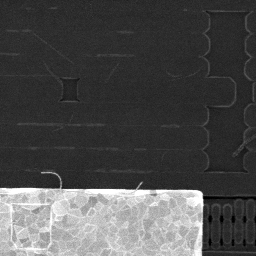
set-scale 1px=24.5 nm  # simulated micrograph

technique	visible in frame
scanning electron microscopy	wiring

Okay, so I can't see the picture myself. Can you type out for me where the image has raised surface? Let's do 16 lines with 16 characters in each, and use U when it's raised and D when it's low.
DDDDDDDDDDDDDDDD
DDDDDDDDDDDDDDDD
DDDDDDDDDDDDDDDD
DDDDDDDDDDDDDDDD
DDDDDDDDDDDDDDDD
DDDDDDDDDDDDDDDD
DDDDDDDDDDDDDDDD
DDDDDDDDDDDDDDDD
DDDDDDDDDDDDDDDD
DDDDDDDDDDDDDDDD
DDDDDDDDDDDDDDDD
DDDDDDDDDDDDDDDD
UUUUUUUUUUUUUDDD
UUUUUUUUUUUUUDDD
UUUUUUUUUUUUUDDD
UUUUUUUUUUUUDDDD